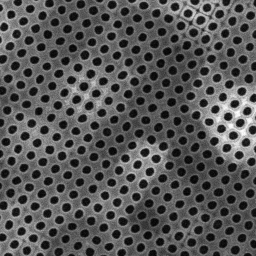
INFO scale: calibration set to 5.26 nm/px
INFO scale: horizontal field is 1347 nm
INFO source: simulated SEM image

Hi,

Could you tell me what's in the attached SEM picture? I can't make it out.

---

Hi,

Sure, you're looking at a regular array of holes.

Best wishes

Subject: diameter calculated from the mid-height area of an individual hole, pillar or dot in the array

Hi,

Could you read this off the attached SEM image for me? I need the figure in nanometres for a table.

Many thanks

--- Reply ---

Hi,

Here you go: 47.9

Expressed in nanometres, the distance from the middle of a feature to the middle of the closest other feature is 72.6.